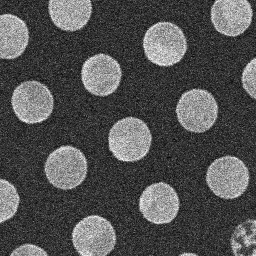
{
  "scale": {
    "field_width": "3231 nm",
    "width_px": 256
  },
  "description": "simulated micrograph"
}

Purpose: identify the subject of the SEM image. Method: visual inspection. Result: a regular array of raised bodies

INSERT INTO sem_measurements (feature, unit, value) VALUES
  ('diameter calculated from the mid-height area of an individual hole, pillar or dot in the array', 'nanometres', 522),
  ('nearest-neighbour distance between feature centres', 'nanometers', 892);